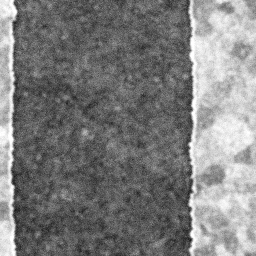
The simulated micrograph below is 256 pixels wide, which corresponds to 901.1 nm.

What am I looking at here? one or a few lines or trenches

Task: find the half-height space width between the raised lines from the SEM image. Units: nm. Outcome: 638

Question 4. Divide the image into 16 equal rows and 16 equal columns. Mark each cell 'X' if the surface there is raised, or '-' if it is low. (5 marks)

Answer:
X-----------XXXX
X-----------XXXX
X-----------XXXX
X-----------XXXX
X-----------XXXX
X-----------XXXX
X-----------XXXX
X-----------XXXX
X-----------XXXX
X-----------XXXX
X-----------XXXX
X-----------XXXX
X-----------XXXX
X-----------XXXX
X-----------XXXX
X-----------XXXX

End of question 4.